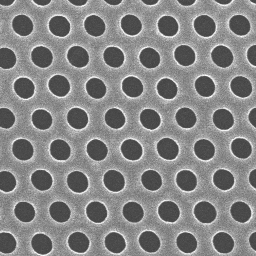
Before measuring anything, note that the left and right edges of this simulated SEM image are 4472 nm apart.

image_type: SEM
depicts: a regular array of holes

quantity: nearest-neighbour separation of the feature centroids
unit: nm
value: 612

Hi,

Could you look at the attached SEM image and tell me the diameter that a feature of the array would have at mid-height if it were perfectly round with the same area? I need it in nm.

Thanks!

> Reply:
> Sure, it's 369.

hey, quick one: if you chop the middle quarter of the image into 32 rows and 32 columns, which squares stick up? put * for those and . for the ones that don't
**...******...******...*******.*
********************************
********************************
.******.********..**************
.*****....*****....*****....****
.****.....****......***.....****
.*****.....****.....***.....****
.*****....*****....*****....****
*******..********.*******..*****
********************************
********************************
**...******...******..*******...
*.....****.....****.....****....
*.....****.....****.....****....
*.....****.....****.....****....
**...******....*****....*****...
********************************
********************************
********************************
******...******...******....****
.*****.....***.....****.....****
..****.....***......***......***
..****.....****.....****....****
.******...******...******...****
********************************
********************************
*********************.********.*
*....*****....******....****....
*.....****.....****.....****....
*.....****.....****.....****....
*.....****.....*****....****....
**...******...*******..*******..